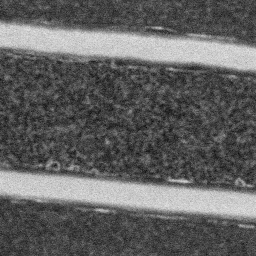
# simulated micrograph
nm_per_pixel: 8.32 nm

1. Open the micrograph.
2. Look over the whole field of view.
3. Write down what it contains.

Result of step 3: one or a few lines or trenches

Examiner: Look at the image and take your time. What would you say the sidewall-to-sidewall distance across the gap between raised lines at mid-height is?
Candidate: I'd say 1230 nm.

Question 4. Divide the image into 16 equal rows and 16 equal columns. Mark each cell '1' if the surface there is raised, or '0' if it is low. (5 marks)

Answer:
1111111111111111
1111111111111111
0001111111111111
0000000000000001
0000000000000000
0000000000000000
0000000000000000
0000000000000000
0000000000000000
0000000000000000
0000000000000000
1000000000000000
1111111111100000
1111111111111111
1111111111111111
1111111111111111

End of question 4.